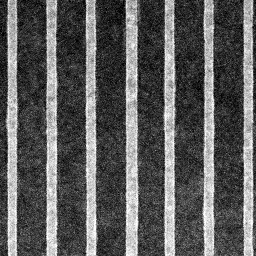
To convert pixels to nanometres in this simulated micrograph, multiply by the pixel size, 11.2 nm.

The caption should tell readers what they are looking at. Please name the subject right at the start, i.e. parallel lines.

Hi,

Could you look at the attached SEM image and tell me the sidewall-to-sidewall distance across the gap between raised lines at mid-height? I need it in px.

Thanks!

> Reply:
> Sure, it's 30.8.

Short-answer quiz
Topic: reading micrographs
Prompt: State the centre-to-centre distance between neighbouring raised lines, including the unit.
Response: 442 nanometres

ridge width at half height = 8.38 px